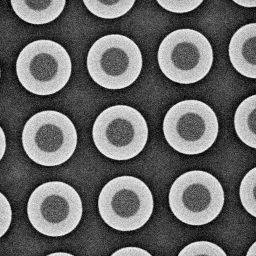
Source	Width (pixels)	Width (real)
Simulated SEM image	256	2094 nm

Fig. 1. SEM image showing an array of small figures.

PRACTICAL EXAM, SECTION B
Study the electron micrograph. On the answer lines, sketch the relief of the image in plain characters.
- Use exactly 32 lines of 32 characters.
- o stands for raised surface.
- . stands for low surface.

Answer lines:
.ooooooo...oooooo...ooooo.....oo
..oooooo...ooooo......o.........
...oooo.........................
..............................oo
.............oo......oooo....ooo
....ooo.....ooooo...oooooo...ooo
...ooooo...ooooooo..ooooooo..ooo
..ooooooo..ooooooo..ooooooo..ooo
..ooooooo..ooooooo..oooooo...ooo
..ooooooo..oooooo....ooooo.....o
...ooooo....oooo................
....ooo.........................
...............................o
..............oo.....ooooo....oo
....oooo....oooooo...oooooo..ooo
...oooooo...oooooo..ooooooo..ooo
...oooooo...oooooo...oooooo...oo
o..ooooooo..oooooo...oooooo...oo
o..oooooo...oooooo....oooo......
....ooooo....oooo...............
.....oo.........................
........................oo.....o
..............ooo.....ooooo...oo
.....oooo....ooooo...ooooooo..oo
....oooooo..ooooooo..ooooooo..oo
o...oooooo..ooooooo..ooooooo..oo
o..ooooooo..ooooooo...ooooo....o
o...oooooo...ooooo.....ooo......
o...ooooo.....ooo...............
......o.........................
........................ooo.....
..............oooo.....ooooo...o